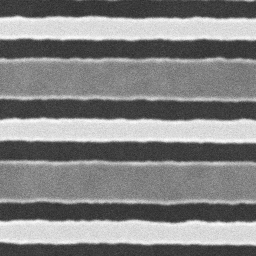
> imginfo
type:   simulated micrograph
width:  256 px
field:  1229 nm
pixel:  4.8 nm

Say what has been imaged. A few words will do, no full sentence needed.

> lines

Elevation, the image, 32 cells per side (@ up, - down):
--------------------------------
--------------------------------
@@@@@@@@@@@@@@@@@@@@@@@@@@@@@@@@
@@@@@@@@@@@@@@@@@@@@@@@@@@@@@@@@
@@@@@@@@@@@@@@@@@@@@@@@@@@@@@@@@
--------------------------------
--------------------------------
@@@@@@@@@@@@@@@@@@@@@@@@@@@@@@@@
@@@@@@@@@@@@@@@@@@@@@@@@@@@@@@@@
@@@@@@@@@@@@@@@@@@@@@@@@@@@@@@@@
@@@@@@@@@@@@@@@@@@@@@@@@@@@@@@@@
@@@@@@@@@@@@@@@@@@@@@@@@@@@@@@@@
----------------------@@@@@@@@@@
--------------------------------
--------------------------------
@@@@@@@@@@@@@@@@@@@@@@@@@@@@@@@@
@@@@@@@@@@@@@@@@@@@@@@@@@@@@@@@@
---@@@@@@@@@@@@@@@@@@@@@@@@@@@@@
--------------------------------
--------------------------------
@@@@@@@@@@@@@@@@@@@@@@@@@@@@@@@@
@@@@@@@@@@@@@@@@@@@@@@@@@@@@@@@@
@@@@@@@@@@@@@@@@@@@@@@@@@@@@@@@@
@@@@@@@@@@@@@@@@@@@@@@@@@@@@@@@@
@@@@@@@@@@@@@@@@@@@@@@@@@@@@@@@@
--------------------@-----------
--------------------------------
--------------------------------
@@@@@@@@@@@@@@@@@@@@@@@@@@@@@@@@
@@@@@@@@@@@@@@@@@@@@@@@@@@@@@@@@
------------------@---@@-@@@@@@@
--------------------------------